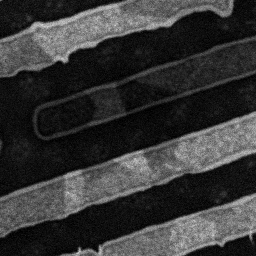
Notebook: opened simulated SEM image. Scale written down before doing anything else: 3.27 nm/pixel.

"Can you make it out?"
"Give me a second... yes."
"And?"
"one or a few lines or trenches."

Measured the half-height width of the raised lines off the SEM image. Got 33.3 pixels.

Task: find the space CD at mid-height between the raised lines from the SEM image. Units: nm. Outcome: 137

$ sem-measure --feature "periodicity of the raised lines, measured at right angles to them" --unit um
0.244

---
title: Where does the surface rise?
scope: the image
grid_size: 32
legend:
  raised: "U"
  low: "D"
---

DDDDDDDDDDDDDDDUUUUUUUUUUUUUUDDD
DDDDDDDDDDDDUUUUUUUUUUUDDDDDDDDD
DDDDDDDDDUUUUUUUUUUUUDDDDDDDDDDD
DDDDUUUUUUUUUUUUUUDDDDDDDDDDDDDD
DDUUUUUUUUUUUUDDDDDDDDDDDDDDDDDD
UUUUUUUUUUUUDDDDDDDDDDDDDDDDDUUU
UUUUUUUUUDDDDDDDDDDDDDDDDDUUUUUU
UUUUUUUDDDDDDDDDDDDDDDDUUUUUUUUU
UUUUDDDDDDDDDDDDDDDDUUUUUUUUUUUU
UUDDDDDDDDDDDDDDDUUUUUUUUUUUUUDD
DDDDDDDDDDDDDDDUUUUUUUUUUUUDDDDD
DDDDDDDDDDDUUUUUUUUUUUUUDDDDDDDD
DDDDDDDDUUUUUUUUUUUUUDDDDDDDDDDD
DDDDDUUUUUUUUUUUUUDDDDDDDDDDDDDD
DDDDUUUUUUUUUUUDDDDDDDDDDDDDDDDU
DDDDUUUUUUUDDDDDDDDDDDDDDDDDUUUU
DDDDDUUUUDDDDDDDDDDDDDDDDUUUUUUU
DDDDDDDDDDDDDDDDDDDDDDUUUUUUUUUU
DDDDDDDDDDDDDDDDDDDDUUUUUUUUUUUU
DDDDDDDDDDDDDDDDUUUUUUUUUUUUUUDD
DDDDDDDDDDDDDUUUUUUUUUUUUUUDDDDD
DDDDDDDDDDUUUUUUUUUUUUUUUDDDDDDD
DDDDDDDUUUUUUUUUUUUUUDDDDDDDDDDD
DDDDUUUUUUUUUUUUUUDDDDDDDDDDDDDD
DUUUUUUUUUUUUUDDDDDDDDDDDDDDDDDD
UUUUUUUUUUUDDDDDDDDDDDDDDDDDDUUU
UUUUUUUUUDDDDDDDDDDDDDDDDUUUUUUU
UUUUUUDDDDDDDDDDDDDDDDUUUUUUUUUU
UUDDDDDDDDDDDDDDDDDUUUUUUUUUUUUU
DDDDDDDDDDDDDDDDDUUUUUUUUUUUUUDD
DDDDDDDDDDDDDUUUUUUUUUUUUUDDDDDD
DDDDDDDDDDUUUUUUUUUUUUUDDDDDDDDD